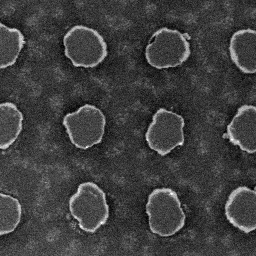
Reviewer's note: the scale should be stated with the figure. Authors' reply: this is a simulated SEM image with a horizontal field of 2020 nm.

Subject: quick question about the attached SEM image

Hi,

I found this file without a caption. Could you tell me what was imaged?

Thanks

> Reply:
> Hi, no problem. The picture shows raised bodies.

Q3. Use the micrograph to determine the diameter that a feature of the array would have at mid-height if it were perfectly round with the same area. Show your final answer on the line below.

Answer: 317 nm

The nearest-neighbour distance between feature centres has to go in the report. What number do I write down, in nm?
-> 624